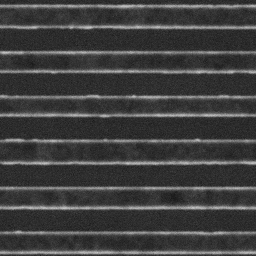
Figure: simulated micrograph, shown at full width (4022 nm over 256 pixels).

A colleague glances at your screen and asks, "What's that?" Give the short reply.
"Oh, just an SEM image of lines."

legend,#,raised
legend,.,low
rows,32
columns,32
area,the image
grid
................................
################################
################################
...#.....................#######
................................
................................
................................
################################
################################
................................
................................
................................
################################
################################
................................
................................
................................
###.#........#..........#.......
################################
################################
................................
................................
................................
################################
################################
################################
................................
................................
................................
################################
################################
################################